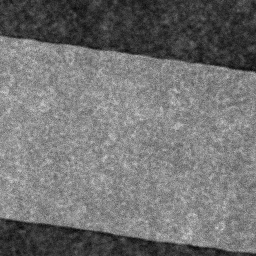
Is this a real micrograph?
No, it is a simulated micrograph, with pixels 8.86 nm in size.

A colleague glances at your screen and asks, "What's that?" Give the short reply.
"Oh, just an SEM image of one or a few lines or trenches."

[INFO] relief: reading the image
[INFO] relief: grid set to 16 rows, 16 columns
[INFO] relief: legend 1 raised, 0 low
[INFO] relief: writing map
0000000000000000
0000000000000000
1100000000000000
1111111110000000
1111111111111111
1111111111111111
1111111111111111
1111111111111111
1111111111111111
1111111111111111
1111111111111111
1111111111111111
1111111111111111
1111111111111111
0000001111111111
0000000000000111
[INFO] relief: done